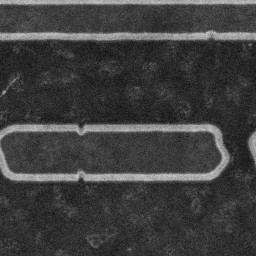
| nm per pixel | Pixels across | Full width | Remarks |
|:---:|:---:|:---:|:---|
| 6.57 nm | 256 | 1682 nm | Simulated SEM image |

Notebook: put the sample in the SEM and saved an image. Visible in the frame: one or a few lines or trenches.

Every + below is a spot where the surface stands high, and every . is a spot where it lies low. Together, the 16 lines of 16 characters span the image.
++++++++++++++++
++++++++++++++++
................
................
................
................
................
................
++++++++++++++..
++++++++++++++..
++++++++++++++..
................
................
................
................
................